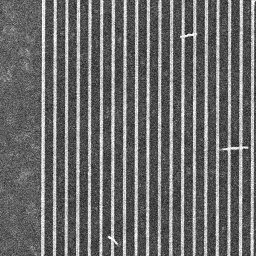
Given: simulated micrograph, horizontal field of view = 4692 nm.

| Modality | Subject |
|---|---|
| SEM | parallel lines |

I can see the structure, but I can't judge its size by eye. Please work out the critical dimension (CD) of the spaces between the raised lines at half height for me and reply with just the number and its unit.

9.5 px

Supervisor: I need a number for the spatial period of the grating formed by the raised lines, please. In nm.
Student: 213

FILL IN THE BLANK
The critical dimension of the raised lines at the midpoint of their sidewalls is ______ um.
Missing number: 0.0481